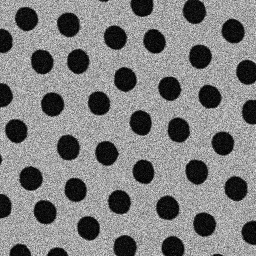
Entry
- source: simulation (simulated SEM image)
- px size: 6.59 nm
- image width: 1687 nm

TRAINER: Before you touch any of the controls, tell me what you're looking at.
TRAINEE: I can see a regular array of holes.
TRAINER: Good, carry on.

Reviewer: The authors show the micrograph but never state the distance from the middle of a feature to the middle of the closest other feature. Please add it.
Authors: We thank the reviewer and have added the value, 255 nm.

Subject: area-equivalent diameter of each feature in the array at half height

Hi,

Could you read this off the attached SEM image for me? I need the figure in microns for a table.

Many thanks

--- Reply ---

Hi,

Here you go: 0.153